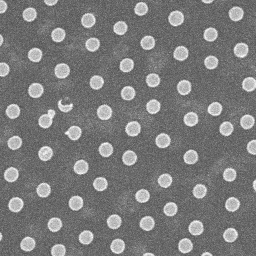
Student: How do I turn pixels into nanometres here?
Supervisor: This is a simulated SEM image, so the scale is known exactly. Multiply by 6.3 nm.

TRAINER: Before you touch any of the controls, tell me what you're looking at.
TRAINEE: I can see a regular array of raised bodies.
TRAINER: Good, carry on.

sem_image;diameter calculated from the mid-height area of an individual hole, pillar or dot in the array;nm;86.4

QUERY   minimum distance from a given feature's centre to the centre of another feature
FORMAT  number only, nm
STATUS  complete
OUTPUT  178